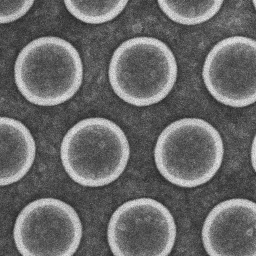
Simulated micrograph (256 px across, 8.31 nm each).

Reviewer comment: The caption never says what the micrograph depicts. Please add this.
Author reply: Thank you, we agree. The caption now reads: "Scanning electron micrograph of raised bodies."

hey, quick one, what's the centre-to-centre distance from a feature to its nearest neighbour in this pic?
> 0.779 µm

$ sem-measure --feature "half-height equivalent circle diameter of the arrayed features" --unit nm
522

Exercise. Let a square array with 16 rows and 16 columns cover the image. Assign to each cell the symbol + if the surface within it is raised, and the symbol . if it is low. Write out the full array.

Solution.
++..+++...+++...
................
..............+.
.++++..++++..+++
.++++..++++..+++
.++++..++++..+++
................
................
++..++++..++++..
++..++++..++++..
++..++++..+++...
................
................
.++++..++++..+++
.++++..++++..+++
.++++..++++..+++